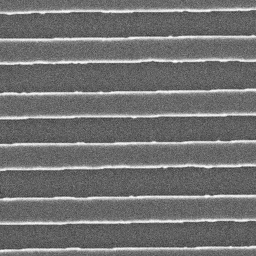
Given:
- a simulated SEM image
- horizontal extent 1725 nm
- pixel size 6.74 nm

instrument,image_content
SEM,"lines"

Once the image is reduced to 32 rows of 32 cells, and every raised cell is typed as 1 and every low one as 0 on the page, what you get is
11111111111111111111111111111111
11111111100001110000000000000000
00000000000000000000000000000000
00000000000000000000000000000000
00000000000000000000000000000000
11111111111111111111111111111111
11111111111111111111111111111111
11111111111111111111111111111111
00000000000000000000000000000000
00000000000000000000000000000000
00000000000000000000000000000000
00000000000000000000001111111111
11111111111111111111111111111111
11111111111111111111111111111111
11111111111111111111000000000000
00000000000000000000000000000000
00000000000000000000000000000000
00000000000000000000000000000000
11111111111111111111111111111111
11111111111111111111111111111111
11111111111111111111111111111111
00000000000000000000000000000000
00000000000000000000000000000000
00000000000000000000000000000000
00000000000000000000000000011111
11111111111111111111111111111111
11111111111111111111111111111111
11111111111111111111111111111111
00000000000000000000000000000000
00000000000000000000000000000000
00000000000000000000000000000000
11111111111111111111111111111111